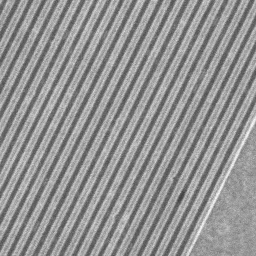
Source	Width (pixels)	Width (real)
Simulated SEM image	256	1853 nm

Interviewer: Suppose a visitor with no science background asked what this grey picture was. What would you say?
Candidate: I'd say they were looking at parallel lines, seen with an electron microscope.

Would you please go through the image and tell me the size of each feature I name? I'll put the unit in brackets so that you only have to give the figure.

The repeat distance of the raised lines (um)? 0.0845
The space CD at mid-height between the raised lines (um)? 0.0389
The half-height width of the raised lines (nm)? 45.5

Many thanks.